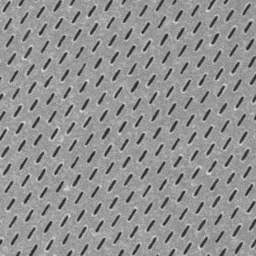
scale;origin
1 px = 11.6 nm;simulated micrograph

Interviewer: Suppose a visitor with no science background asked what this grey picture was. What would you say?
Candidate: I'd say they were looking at a regular array of holes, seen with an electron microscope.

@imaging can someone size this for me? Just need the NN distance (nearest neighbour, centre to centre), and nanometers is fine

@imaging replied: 200